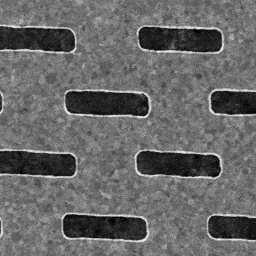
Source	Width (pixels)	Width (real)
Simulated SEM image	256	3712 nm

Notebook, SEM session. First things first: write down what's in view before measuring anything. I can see holes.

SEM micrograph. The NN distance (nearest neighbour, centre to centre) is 1.38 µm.